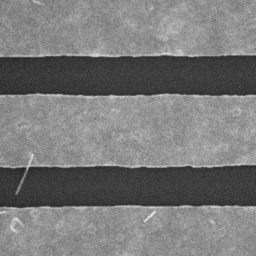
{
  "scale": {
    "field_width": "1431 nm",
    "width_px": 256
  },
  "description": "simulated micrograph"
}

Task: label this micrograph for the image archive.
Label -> lines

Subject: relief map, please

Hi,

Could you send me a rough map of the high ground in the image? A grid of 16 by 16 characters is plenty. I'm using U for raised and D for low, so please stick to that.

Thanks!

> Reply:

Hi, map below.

UUUUUUUUUUUUUUUU
UUUUUUUUUUUUUUUU
UUUUUUUUUUUUUUUU
UUUDDUUUUDDUUDDD
DDDDDDDDDDDDDDDD
DDDDDDDDDDDDDDDD
UUUUUUUUUUUUUUUU
UUUUUUUUUUUUUUUU
UUUUUUUUUUUUUUUU
UUUUUUUUUUUUUUUU
DDDDDDDDDDDDDDDD
DDDDDDDDDDDDDDDD
DDDDDDDDDDDDDDDD
UUUUUUUUUUUUUUUU
UUUUUUUUUUUUUUUU
UUUUUUUUUUUUUUUU